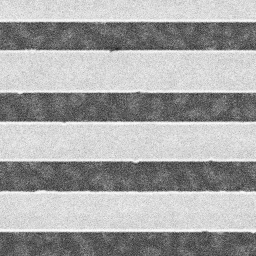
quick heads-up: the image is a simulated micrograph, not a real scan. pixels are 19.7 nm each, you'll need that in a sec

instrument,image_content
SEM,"one or a few lines or trenches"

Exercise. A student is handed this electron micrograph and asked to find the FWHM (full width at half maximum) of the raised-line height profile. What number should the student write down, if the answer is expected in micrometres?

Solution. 0.762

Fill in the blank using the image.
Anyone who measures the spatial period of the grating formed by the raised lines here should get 1380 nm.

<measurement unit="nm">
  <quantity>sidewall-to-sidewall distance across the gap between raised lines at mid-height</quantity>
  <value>612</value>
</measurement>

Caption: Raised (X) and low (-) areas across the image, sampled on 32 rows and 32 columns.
XXXXXXXXXXXXXXXXXXXXXXXXXXXXXXXX
XXXXXXXXXXXXXXXXXXXXXXXXXXXXXXXX
XXXXXXXXXXXXXXXXXXXXXXXXXXXXXXXX
--------------------------------
--------------------------------
--------------------------------
XXXXXXXXXXXXXXXXXXXXXXXXXXXXXXXX
XXXXXXXXXXXXXXXXXXXXXXXXXXXXXXXX
XXXXXXXXXXXXXXXXXXXXXXXXXXXXXXXX
XXXXXXXXXXXXXXXXXXXXXXXXXXXXXXXX
XXXXXXXXXXXXXXXXXXXXXXXXXXXXXXXX
--XX----------------------------
--------------------------------
--------------------------------
--------------------------------
XXXXXXXXXXXXXXXXXXXXXXXXXXXXXXXX
XXXXXXXXXXXXXXXXXXXXXXXXXXXXXXXX
XXXXXXXXXXXXXXXXXXXXXXXXXXXXXXXX
XXXXXXXXXXXXXXXXXXXXXXXXXXXXXXXX
XXXXXXXXXXXXXXXXXXXXXXXXXXXXXXXX
--------------------------------
--------------------------------
--------------------------------
--------------------------------
XXXXXXXXXXXXXXXXXXXXXXXXXXXXXXXX
XXXXXXXXXXXXXXXXXXXXXXXXXXXXXXXX
XXXXXXXXXXXXXXXXXXXXXXXXXXXXXXXX
XXXXXXXXXXXXXXXXXXXXXXXXXXXXXXXX
XXXXXXXXXXXXXXXXXXXXXXXXXXXXXXXX
--------------------------------
--------------------------------
--------------------------------